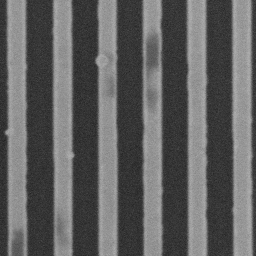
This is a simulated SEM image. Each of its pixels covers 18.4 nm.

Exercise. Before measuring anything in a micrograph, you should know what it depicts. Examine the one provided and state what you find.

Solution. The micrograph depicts lines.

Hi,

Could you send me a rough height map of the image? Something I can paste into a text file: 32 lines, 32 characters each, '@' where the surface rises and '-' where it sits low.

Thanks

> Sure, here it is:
-@@----@@---@@----@@---@@@---@@-
-@@----@@---@@----@@---@@@---@@-
-@@----@@---@@----@@---@@@---@@-
-@@----@@---@@----@@---@@@---@@-
-@@----@@---@@----@@---@@@---@@-
-@@----@@---@@----@@---@@@---@@-
-@@----@@---@@----@@---@@@---@@-
-@@----@@---@@----@@---@@@---@@-
-@@----@@---@@----@@----@@---@@-
-@@----@@---@@----@@---@@@---@@-
-@@----@@---@@----@@---@@@---@@-
-@@----@@---@@----@@----@@---@@-
-@@----@@---@@----@@----@@---@@-
-@@----@@---@@----@@----@@---@@-
-@@----@@---@@----@@----@@---@@-
-@@----@@---@@----@@----@@---@@-
-@@----@@---@@----@@----@@---@@-
-@@----@@---@@@---@@----@@---@@-
-@@----@@---@@@---@@----@@---@@-
-@@----@@---@@@---@@----@@---@@-
-@@----@@---@@@---@@----@@---@@-
-@@----@@----@@---@@----@@---@@-
-@@----@@---@@@---@@----@@---@@-
-@@----@@---@@@---@@----@@---@@-
-@@----@@---@@@---@@----@@---@@-
-@@----@@---@@@---@@----@@---@@-
-@@----@@---@@@---@@----@@---@@-
-@@----@@---@@@---@@----@@---@@-
-@@----@@---@@@---@@----@@---@@-
-@@----@@---@@@---@@----@@---@@-
-@@----@@---@@@---@@----@@---@@-
-@@----@@---@@@---@@----@@---@@-